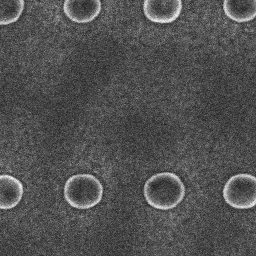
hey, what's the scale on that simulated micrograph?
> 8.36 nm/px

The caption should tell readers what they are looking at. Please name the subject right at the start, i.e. raised bodies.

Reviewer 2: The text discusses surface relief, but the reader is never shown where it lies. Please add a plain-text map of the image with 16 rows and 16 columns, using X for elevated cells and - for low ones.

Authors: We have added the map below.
X---XX---XX---XX
----------------
----------------
----------------
----------------
----------------
----------------
----------------
----------------
----------------
----------------
X---XX---XX---XX
X---XX---XX---XX
----------------
----------------
----------------